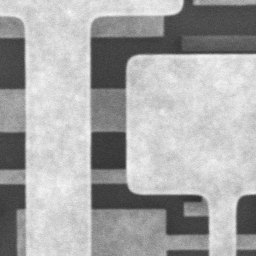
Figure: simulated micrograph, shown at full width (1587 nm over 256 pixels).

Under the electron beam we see wiring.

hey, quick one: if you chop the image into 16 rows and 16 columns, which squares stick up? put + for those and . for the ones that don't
+++++++++++.....
.+++++..........
..++++..........
..++++...+++++++
..++++..++++++++
..++++..++++++++
..++++..++++++++
..++++..++++++++
..++++..++++++++
..++++..++++++++
..++++..++++++++
..++++..++++++++
..++++.......++.
..++++.......++.
..++++.......++.
..++++.......++.